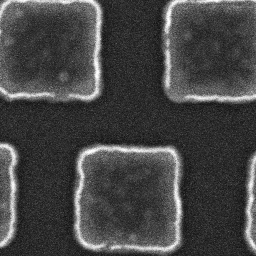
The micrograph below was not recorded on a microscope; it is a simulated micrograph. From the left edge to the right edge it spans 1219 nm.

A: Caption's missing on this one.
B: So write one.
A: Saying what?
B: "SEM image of raised bodies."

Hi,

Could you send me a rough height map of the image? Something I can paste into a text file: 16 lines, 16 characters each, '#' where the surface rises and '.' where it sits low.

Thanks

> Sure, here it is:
######.....#####
######....######
######....######
######....######
######....######
######....######
................
................
................
#....######.....
#....######.....
#....######.....
#....######.....
#....######.....
#....######....#
.......####.....